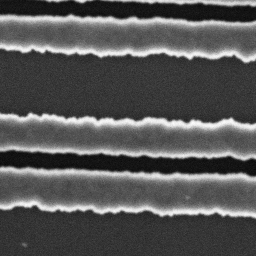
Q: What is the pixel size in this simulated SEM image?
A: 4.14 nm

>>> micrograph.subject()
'lines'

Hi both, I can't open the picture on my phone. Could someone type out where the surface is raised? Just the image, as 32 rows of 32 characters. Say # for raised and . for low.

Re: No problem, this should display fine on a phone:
......................#...######
................................
#######################.........
################################
################################
################################
.......#########################
..............................##
................................
................................
................................
................................
................................
................................
##.####.........................
##########################.###..
################################
################################
################################
................#..#############
................................
##############.#................
################################
################################
################################
################################
............#.#....#############
................................
................................
................................
................................
................................